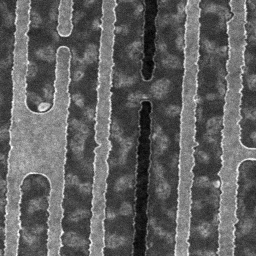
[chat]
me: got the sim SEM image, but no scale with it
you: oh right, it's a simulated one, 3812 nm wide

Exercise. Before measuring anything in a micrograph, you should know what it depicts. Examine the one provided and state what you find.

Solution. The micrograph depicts parallel lines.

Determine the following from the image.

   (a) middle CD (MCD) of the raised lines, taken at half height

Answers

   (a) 197 nanometers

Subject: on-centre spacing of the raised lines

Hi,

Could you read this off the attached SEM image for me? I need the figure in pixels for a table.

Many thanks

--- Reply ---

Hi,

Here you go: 42.9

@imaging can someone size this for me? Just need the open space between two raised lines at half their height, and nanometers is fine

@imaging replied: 437